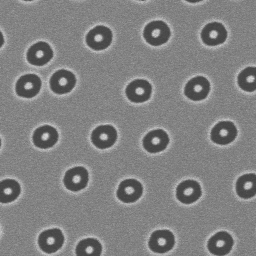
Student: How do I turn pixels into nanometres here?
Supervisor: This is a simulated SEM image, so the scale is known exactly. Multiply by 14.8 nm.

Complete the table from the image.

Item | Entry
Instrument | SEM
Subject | a regular array of ring-shaped grooves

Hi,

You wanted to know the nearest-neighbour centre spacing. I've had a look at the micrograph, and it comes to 0.772 um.